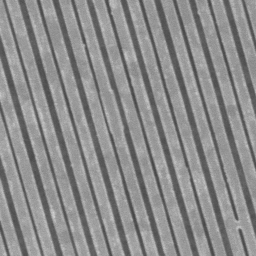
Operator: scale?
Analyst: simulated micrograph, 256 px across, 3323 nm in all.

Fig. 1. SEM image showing parallel lines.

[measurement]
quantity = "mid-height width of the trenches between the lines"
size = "60.9 nanometers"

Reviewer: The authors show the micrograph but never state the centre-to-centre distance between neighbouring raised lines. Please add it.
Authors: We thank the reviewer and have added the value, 213 nm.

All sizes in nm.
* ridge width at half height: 142